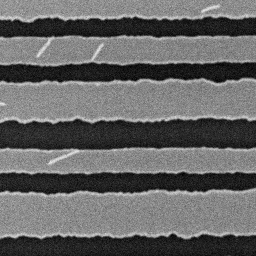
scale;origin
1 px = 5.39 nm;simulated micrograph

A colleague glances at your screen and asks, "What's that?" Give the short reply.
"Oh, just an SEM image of lines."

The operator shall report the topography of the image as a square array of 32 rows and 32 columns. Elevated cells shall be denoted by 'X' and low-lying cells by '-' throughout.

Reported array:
XXXXXXXXXXXXXXXXXXXXXXXXXXXXXXXX
XXXXXXXXXXXXXXXXXXXXXXXXXXXXXXXX
--XX----------------------------
--------------------------------
--------------------------------
XXXXXXXXXXXXXXXXXXXXXXXXXXXXXXXX
XXXXXXXXXXXXXXXXXXXXXXXXXXXXXXXX
XXXXXXXXXXXXXXXXXXXXXXXXXXXXXXXX
--------------------------------
--------------------------------
XXXXXXXXXXXXXXXXXXXXXXXXXXXXXXXX
XXXXXXXXXXXXXXXXXXXXXXXXXXXXXXXX
XXXXXXXXXXXXXXXXXXXXXXXXXXXXXXXX
XXXXXXXXXXXXXXXXXXXXXXXXXXXXXXXX
XXXXXXXXXXXXXXXXXXXXXXXXXXXXXXXX
--------------------------------
--------------------------------
--------------------------------
-------------------------X------
XXXXXXXXXXXXXXXXXXXXXXXXXXXXXXXX
XXXXXXXXXXXXXXXXXXXXXXXXXXXXXXXX
X-XXXXXXXXXXX-X-XXXXXXXXXXXXXXXX
--------------------------------
--------------------------------
XXXXXXXXXXXXXXXXXXXXXXXXXXXXXXXX
XXXXXXXXXXXXXXXXXXXXXXXXXXXXXXXX
XXXXXXXXXXXXXXXXXXXXXXXXXXXXXXXX
XXXXXXXXXXXXXXXXXXXXXXXXXXXXXXXX
XXXXXXXXXXXXXXXXXXXXXXXXXXXXXXXX
XX-XXX---XXX-XXX--XX--XXX-------
--------------------------------
--------------------------------